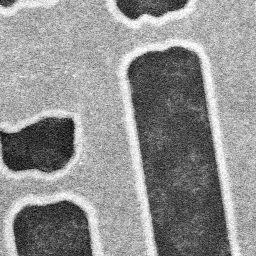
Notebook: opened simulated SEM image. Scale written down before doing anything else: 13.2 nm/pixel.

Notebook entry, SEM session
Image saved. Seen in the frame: one or a few lines or trenches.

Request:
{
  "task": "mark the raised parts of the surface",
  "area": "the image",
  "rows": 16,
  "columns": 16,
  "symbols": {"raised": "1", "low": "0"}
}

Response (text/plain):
0111111000001111
1111111111111111
1111111111111111
1111111100000111
1111111100000111
1111111100000111
1111111100000111
1100011100000111
0000011100000011
0000011100000011
0000111110000011
1111111110000011
1110011110000011
1000001110000011
1000001110000001
1000001110000001